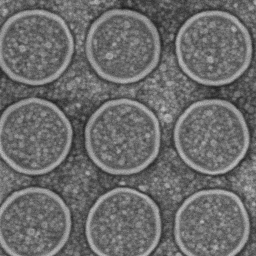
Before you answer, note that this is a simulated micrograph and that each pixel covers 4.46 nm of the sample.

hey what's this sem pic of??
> raised bodies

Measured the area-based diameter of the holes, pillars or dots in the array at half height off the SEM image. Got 320 nm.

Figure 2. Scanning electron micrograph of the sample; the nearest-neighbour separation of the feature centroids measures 397 nm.